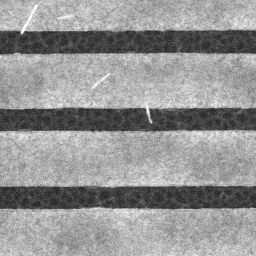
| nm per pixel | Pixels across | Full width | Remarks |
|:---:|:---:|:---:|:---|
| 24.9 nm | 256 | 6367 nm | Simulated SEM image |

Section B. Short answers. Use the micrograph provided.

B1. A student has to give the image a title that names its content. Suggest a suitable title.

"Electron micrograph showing one or a few lines or trenches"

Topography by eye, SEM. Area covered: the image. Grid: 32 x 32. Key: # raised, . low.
################################
################################
################################
################################
................................
................................
................#...............
################################
################################
################################
################################
################################
################################
####...#..........#.##..........
................................
...#............................
#.###.##########################
################################
################################
################################
################################
################################
################################
...........#....................
...................#............
................................
################################
################################
################################
################################
################################
################################